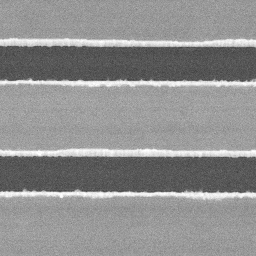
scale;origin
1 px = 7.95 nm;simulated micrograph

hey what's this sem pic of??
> lines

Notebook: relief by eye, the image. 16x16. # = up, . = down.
################
################
################
................
................
################
################
################
################
################
................
................
################
################
################
################